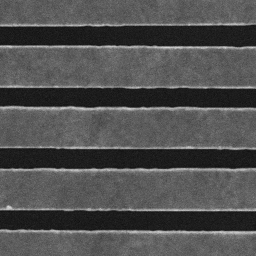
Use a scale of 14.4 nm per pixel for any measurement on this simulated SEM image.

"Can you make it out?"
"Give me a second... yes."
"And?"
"lines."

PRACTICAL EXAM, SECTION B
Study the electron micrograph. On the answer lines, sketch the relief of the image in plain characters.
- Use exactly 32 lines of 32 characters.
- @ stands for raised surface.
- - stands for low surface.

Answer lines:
@@@@@@@@@@@@@@@@@@@@@@@@@@@@@@@@
@@@@@@@@@@@@@@@@@@@@@@@@@@@@@@@@
@@@@@@@@@@@@@@@@@@@@@@@@@@@@@@@@
--------------------------------
--------------------------------
--------------------------------
@@@@@@@@@@@@@@@@@@@@@@@@@@@@@@@@
@@@@@@@@@@@@@@@@@@@@@@@@@@@@@@@@
@@@@@@@@@@@@@@@@@@@@@@@@@@@@@@@@
@@@@@@@@@@@@@@@@@@@@@@@@@@@@@@@@
@@@@@@@@@@@@@@@@@@@@@@@@@@@@@@@@
--------------------------------
--------------------------------
@@@@@@@@@@@-@@@@-@-@@@@@@-------
@@@@@@@@@@@@@@@@@@@@@@@@@@@@@@@@
@@@@@@@@@@@@@@@@@@@@@@@@@@@@@@@@
@@@@@@@@@@@@@@@@@@@@@@@@@@@@@@@@
@@@@@@@@@@@@@@@@@@@@@@@@@@@@@@@@
-------@@@@@@@@@@@@@@@@@@@@@@@@@
--------------------------------
--------------------------------
@@@@@@@@@@@@@@@@@@@@@@@@@@@@@@@@
@@@@@@@@@@@@@@@@@@@@@@@@@@@@@@@@
@@@@@@@@@@@@@@@@@@@@@@@@@@@@@@@@
@@@@@@@@@@@@@@@@@@@@@@@@@@@@@@@@
@@@@@@@@@@@@@@@@@@@@@@@@@@@@@@@@
--------------------------------
--------------------------------
--------------------------------
@@@@@@@@@@@@@@@@@@@@@@@@@@@@@@@@
@@@@@@@@@@@@@@@@@@@@@@@@@@@@@@@@
@@@@@@@@@@@@@@@@@@@@@@@@@@@@@@@@